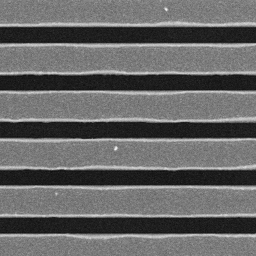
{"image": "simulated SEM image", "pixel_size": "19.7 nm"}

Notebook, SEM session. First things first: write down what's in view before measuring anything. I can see lines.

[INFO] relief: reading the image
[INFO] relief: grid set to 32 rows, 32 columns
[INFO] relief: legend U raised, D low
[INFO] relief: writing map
UUUUUUUUUUUUUUUUUUUUUUUUUUUUUUUU
UUUUUUUUUUUUUUUUUUUUUUUUUUUUUUUU
UUUUUUUUUUUUUUUUUUUUUUUUUUUUUUUU
DDDDDDDDDDDDDDDDDDDDDDDDDDDDDDDD
DDDDDDDDDDDDDDDDDDDDDDDDDDDDDDDD
UUUUUUUUUUUDDUUDDUUUUUUUUUUUDUUU
UUUUUUUUUUUUUUUUUUUUUUUUUUUUUUUU
UUUUUUUUUUUUUUUUUUUUUUUUUUUUUUUU
UUUUUUUUUUUUUUUUUUUUUUUUUUUUUUUU
DDDDDDDDDDDDDDDDDDDDDDDDDDDDDDDD
DDDDDDDDDDDDDDDDDDDDDDDDDDDDDDDD
UUUUUUUUUUUUUUUUUUUUUUUUUUUUUUUU
UUUUUUUUUUUUUUUUUUUUUUUUUUUUUUUU
UUUUUUUUUUUUUUUUUUUUUUUUUUUUUUUU
UUUUUUUUUUUUUUUUUUUUUUUUUUUUUUUU
DDDDDDDDDDDDDDDDDDDDDDDDDDDDDDDD
DDDDDDDDDDDDDDDDDDDDDDDDDDDDDDDD
UUUUUUUUUUUUUUUUUUUUUUUUUUUUUUUU
UUUUUUUUUUUUUUUUUUUUUUUUUUUUUUUU
UUUUUUUUUUUUUUUUUUUUUUUUUUUUUUUU
UUUUUUUUUUUUUUUUUUUUUUUUUUUUUUUU
DDDDDDDDDDDDDDDDDDDDDDDDDDDDDDDD
DDDDDDDDDDDDDDDDDDDDDDDDDDDDDDDD
UUUUUUUUUUUUUUUUUUUUUUUUUUUUUUUU
UUUUUUUUUUUUUUUUUUUUUUUUUUUUUUUU
UUUUUUUUUUUUUUUUUUUUUUUUUUUUUUUU
UUUUUUUUUUUUUUUUUUUUUUUUUUUUUUUU
DDDDDDDDDDDDDDDDDDDDDDDDDDDDDDDD
DDDDDDDDDDDDDDDDDDDDDDDDDDDDDDDD
UUUUUUUUUUUUUUUUUUUUUUUUUUUUUUUU
UUUUUUUUUUUUUUUUUUUUUUUUUUUUUUUU
UUUUUUUUUUUUUUUUUUUUUUUUUUUUUUUU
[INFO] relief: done